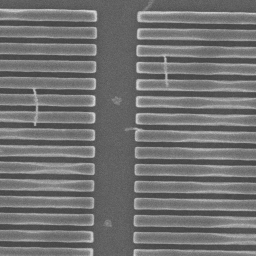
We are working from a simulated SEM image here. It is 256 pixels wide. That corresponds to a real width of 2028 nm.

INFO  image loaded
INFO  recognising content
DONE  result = groups of lines, slits or small figures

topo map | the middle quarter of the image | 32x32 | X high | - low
XXXXXXXX----------XXXXXXXXXXXXXX
XXXXXXXX----------XXXXXXXXXXXXXX
-------------------------X------
--------------------------------
XXXXXXXX----------XXXXXXXXXXXXXX
XXXXXXXX----------XXXXXXXXXXXXXX
--------------------------------
--------------------------------
XXXXXXXX----------XXXX-------XXX
XXXXXXXX----------XXXXXXXXXXXXXX
--------------------------XXXXXX
--------------------------------
XXXXXXX-------------------------
XXXXXXXX----------XXXXXXXXXXXXXX
XXXXXXX-----------XXXXXXXXXXXXXX
--------------------------------
--------------------------------
XXXXXXXX----------XXXXXXXXXXXXXX
XXXXXXXX----------XXXXXXXXXXXXXX
--------------------------------
--------------------------------
XXXXXXXX----------XXXXXXXXXXXXXX
XXXXXXXX----------XXXXXXXXXXXXXX
----------------------------XXXX
--------------------------------
XXXXXXXX----------XXXXXXXXXXXXXX
XXXXXXXX----------XXXXXXXXXXXXXX
------X-----------XXXXXXXXXXXXXX
--------------------------------
--XXXXX-----------XXX-----------
XXXXXXX-----------XXXXXXXXXXXXXX
--XXXXX-----------XXXXXXXXXXXXXX